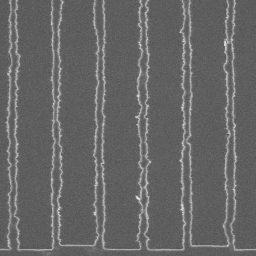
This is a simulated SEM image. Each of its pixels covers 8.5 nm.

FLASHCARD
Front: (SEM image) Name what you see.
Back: parallel lines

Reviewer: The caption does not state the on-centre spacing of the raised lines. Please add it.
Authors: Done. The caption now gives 0.369 micrometres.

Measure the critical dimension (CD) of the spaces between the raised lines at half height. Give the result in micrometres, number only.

0.304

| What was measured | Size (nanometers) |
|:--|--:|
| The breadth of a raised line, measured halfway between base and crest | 65.9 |